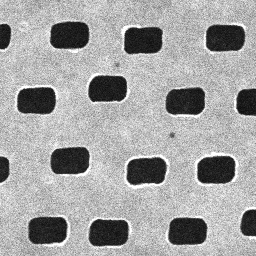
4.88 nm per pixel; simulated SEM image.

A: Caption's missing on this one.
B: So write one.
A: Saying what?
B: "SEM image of a regular array of holes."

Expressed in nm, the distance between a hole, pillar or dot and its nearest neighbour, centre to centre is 331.